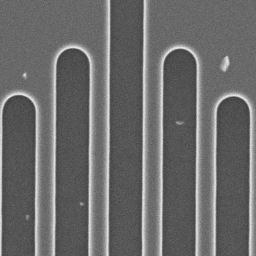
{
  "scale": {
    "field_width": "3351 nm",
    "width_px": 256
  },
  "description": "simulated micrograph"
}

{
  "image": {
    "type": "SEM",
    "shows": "groups of lines, slits or small figures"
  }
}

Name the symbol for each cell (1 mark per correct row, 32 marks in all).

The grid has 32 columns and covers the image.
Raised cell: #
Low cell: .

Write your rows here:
##############....##############
##############....##############
##############....##############
##############....##############
##############....##############
##############....##############
########...###....###...########
#######....###....##.....#######
#######....###....##.....#######
#######....###....##.....#######
#######....###....##.....#######
#######....###....##.....#######
#...###....###....##.....###...#
....###....###....##.....##....#
.....##....###....##.....##....#
.....##....###....##.....##....#
.....##....###....##.....##....#
.....##....###....##.....##....#
.....##....###....##.....##....#
.....##....##.....##.....##....#
.....##....##.....##.....##....#
.....##....##.....##.....##....#
.....##....##.....##.....##....#
.....##....##.....##.....##....#
.....##....##.....##.....##....#
....###....##.....##.....##....#
.....##....##.....##.....##....#
....###....##.....##.....##....#
....###....##.....##.....##....#
....###....##.....##.....##....#
....###....##.....##.....##....#
....###....##.....##.....##....#